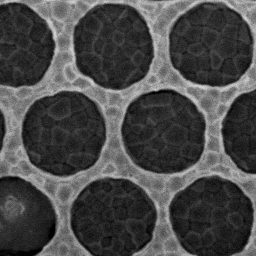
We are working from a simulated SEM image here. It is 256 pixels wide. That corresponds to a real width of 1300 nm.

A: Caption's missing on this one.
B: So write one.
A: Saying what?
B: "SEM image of holes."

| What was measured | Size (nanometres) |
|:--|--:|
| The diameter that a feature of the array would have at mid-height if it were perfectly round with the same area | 432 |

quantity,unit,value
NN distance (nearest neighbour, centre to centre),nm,501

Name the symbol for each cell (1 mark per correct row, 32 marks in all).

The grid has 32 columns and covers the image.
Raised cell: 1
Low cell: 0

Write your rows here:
00011111111110011111111110001111
00001111111000000111111000000011
00000011110000000011110000000001
00000011100000000001100000000001
00000001100000000001100000000000
00000001100000000001100000000000
00000001100000000001100000000000
00000011100000000001100000000000
00000011110000000001110000000001
00000111111000000011111000000011
00001111111100000111111110000111
11111110001111111110001111111110
11111000000011111000000011111000
11110000000011110000000001111000
11100000000001110000000001110000
01100000000001100000000000110000
01100000000001100000000000110000
11100000000001100000000000110000
11100000000001110000000001110000
11100000000011110000000001111000
11110000000011111000000011111000
11111100001111111110001111111110
00011111111100001111111110000111
00000111111000000011111000000011
00000011110000000001110000000001
00000001100000000001100000000000
00000001100000000000100000000000
00000001100000000000100000000000
00000001100000000001110000000000
00000001100000000001110000000001
00000011110000000011110000000001
00000111111000000111111000000011